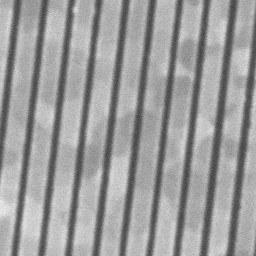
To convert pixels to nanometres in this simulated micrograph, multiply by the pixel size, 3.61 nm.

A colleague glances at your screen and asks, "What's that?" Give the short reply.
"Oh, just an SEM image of parallel lines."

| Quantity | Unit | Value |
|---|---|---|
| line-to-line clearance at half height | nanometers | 30.9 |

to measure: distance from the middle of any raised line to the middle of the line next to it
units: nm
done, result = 96.7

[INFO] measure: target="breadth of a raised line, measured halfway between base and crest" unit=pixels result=18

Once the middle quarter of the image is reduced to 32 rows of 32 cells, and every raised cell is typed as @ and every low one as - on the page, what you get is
-@@@@@--@@@@---@@@@--@@@@@--@@@@
-@@@@---@@@@---@@@@--@@@@@--@@@@
-@@@@---@@@@---@@@@--@@@@@--@@@@
-@@@@--@@@@@--@@@@@--@@@@@--@@@@
-@@@@--@@@@@--@@@@@--@@@@---@@@@
-@@@@--@@@@@--@@@@---@@@@--@@@@@
@@@@@--@@@@@--@@@@---@@@@---@@@@
@@@@@--@@@@@--@@@@---@@@@--@@@@@
@@@@@--@@@@---@@@@--@@@@@--@@@@@
@@@@---@@@@---@@@@--@@@@@--@@@@@
@@@@---@@@@---@@@@--@@@@@--@@@@-
@@@@---@@@@--@@@@@--@@@@@--@@@@-
@@@@--@@@@@--@@@@@--@@@@---@@@@-
@@@@--@@@@@--@@@@---@@@@--@@@@@-
@@@@--@@@@@--@@@@---@@@@--@@@@@-
@@@@--@@@@@--@@@@---@@@@--@@@@@-
@@@@--@@@@---@@@@--@@@@@--@@@@@-
@@@---@@@@---@@@@--@@@@@--@@@@@-
@@@---@@@@---@@@@--@@@@@--@@@@--
@@@---@@@@--@@@@@--@@@@@--@@@@--
@@@--@@@@@--@@@@@--@@@@@--@@@@--
@@@--@@@@@--@@@@@--@@@@---@@@@--
@@@--@@@@@--@@@@---@@@@--@@@@@--
@@@--@@@@@--@@@@---@@@@--@@@@@--
@@@--@@@@@--@@@@--@@@@@--@@@@@--
@@@--@@@@---@@@@--@@@@@--@@@@@--
@@---@@@@---@@@@--@@@@@--@@@@---
@@---@@@@---@@@@--@@@@@--@@@@---
@@--@@@@@---@@@@--@@@@@--@@@@---
@@--@@@@@---@@@@--@@@@---@@@@---
@@--@@@@@--@@@@---@@@@--@@@@@--@
@@--@@@@@--@@@@---@@@@--@@@@@--@